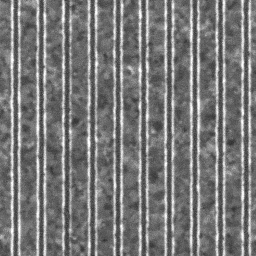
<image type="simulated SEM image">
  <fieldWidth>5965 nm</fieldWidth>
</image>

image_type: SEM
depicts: parallel lines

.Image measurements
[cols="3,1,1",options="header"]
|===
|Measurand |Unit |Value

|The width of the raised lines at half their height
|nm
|431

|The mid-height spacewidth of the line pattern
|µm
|0.163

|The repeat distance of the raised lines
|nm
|597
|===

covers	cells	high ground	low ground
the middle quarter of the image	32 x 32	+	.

..++++..+++++..++++..++++..+++++
..++++..+++++..++++..++++..+++++
..++++..+++++..++++..+++++.+++++
..++++..+++++..++++..++++..+++++
..++++..+++++..++++..++++..+++++
..++++..+++++..++++..+++++.+++++
..++++..+++++..++++..+++++.+++++
..++++..+++++..++++..+++++.+++++
..++++..+++++..++++..++++..+++++
..++++..+++++..++++..++++..+++++
..++++..+++++..++++..++++..+++++
..++++..+++++..++++..++++..+++++
..++++..+++++..++++..++++..+++++
..++++..+++++..++++..++++..+++++
..++++..+++++..++++..++++..+++++
..++++..+++++..++++..++++..+++++
..++++..+++++..++++..++++..+++++
..++++..+++++..++++..++++..+++++
..++++..+++++..++++..++++..+++++
..++++..+++++..++++..++++..+++++
..++++..+++++..++++..++++..+++++
..++++..+++++..++++..++++..+++++
..++++..+++++..++++..++++..+++++
..++++..+++++..++++..++++..+++++
..++++..+++++..++++..++++..+++++
..++++..+++++..++++..++++..+++++
..++++..+++++..++++..++++..+++++
..++++..+++++..++++..++++..+++++
..++++..+++++..++++..++++..+++++
..++++..+++++..++++..++++..+++++
..++++..+++++..++++..++++..+++++
..++++..+++++..++++..+++++.+++++